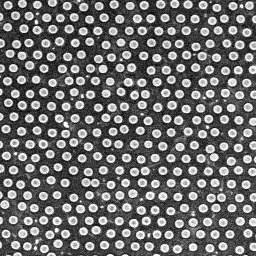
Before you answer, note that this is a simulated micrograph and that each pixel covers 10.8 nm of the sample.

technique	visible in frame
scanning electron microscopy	a regular array of raised bodies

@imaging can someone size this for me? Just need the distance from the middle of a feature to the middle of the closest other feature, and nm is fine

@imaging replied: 140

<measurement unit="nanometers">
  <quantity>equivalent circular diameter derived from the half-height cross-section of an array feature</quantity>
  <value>84.8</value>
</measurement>